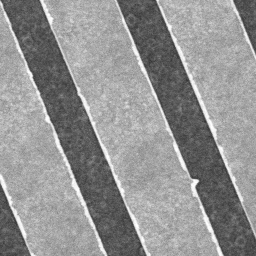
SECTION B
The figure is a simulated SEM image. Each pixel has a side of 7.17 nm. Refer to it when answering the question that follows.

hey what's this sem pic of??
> one or a few lines or trenches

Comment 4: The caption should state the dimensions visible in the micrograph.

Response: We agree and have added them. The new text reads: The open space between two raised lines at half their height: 275 nm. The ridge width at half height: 495 nanometers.